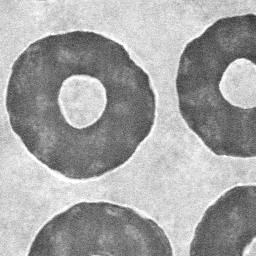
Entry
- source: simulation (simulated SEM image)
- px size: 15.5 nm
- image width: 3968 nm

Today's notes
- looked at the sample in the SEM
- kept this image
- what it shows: ring-shaped grooves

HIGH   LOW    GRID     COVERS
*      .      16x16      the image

****************
*************...
**.....*****....
*.......***.....
*........**...**
....**....*...**
....***...*....*
*...**....**....
*........***....
**......*****...
***....*********
****************
*************...
***......****...
**........**....
**.........*...*